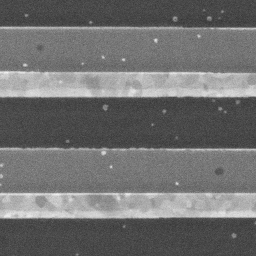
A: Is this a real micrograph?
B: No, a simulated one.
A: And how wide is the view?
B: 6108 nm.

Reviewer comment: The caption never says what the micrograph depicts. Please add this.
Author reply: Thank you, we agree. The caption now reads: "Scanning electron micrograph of lines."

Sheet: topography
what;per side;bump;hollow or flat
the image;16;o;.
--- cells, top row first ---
................
................
oooooooooooooooo
oooooooooooooooo
oooooooooooooooo
oooooooooooooooo
................
................
................
oooooooooooooooo
oooooooooooooooo
oooooooooooooooo
oooooooooooooooo
oooooooooooooooo
................
................